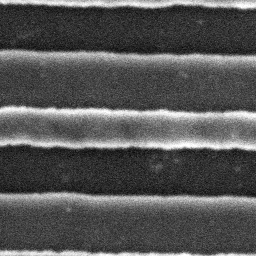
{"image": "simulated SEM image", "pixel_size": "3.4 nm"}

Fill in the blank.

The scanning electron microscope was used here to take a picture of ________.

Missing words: lines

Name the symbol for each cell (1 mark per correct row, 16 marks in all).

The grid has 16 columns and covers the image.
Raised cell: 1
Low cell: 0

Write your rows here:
0000000000000000
0000000000000000
0000000000000000
1111111111111100
1111111111111111
1111111111111111
1111111111111111
1111111111111111
1111111111111111
0000000000000000
0000000000000000
0000000000000000
1111111111111111
1111111111111111
1111111111111111
1111111111111111